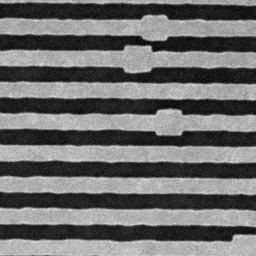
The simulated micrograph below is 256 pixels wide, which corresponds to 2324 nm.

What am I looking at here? wiring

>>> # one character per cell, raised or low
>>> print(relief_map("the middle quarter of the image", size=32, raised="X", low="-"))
XX--X------XXXXXXXXXXXXXXXXXXXXX
---------------XXXXXXX----------
--------------------------------
--------------------------------
--------------------------------
XXXXXXXXXXXXXXXXXXXXXXXXXXXXXXXX
XXXXXXXXXXXXXXXXXXXXXXXXXXXXXXXX
XXXXXXXXXXXXXXXXXXXXXXXXXXXXXXXX
XXX-----------X-XXXXXXXXXXXXXXXX
--------------------------------
--------------------------------
--------------------------X-----
-----------------------XXXXXX---
XXXXXXXXXXXXXXXXXXXXXXXXXXXXXXXX
XXXXXXXXXXXXXXXXXXXXXXXXXXXXXXXX
XXXXXXXXXXXXXXXXXXXXXXXXXXXXXXXX
-------------------XXXXXXXXXXX--
-----------------------XXXXXX---
--------------------------------
--------------------------------
--------------------------------
XXXXXXXXXXXXXXXXXXXXXXXXXXXXXXXX
XXXXXXXXXXXXXXXXXXXXXXXXXXXXXXXX
XXXXXXXXXXXXXXXXXXXXXXXXXXXXXXXX
-----------XX----------------X-X
--------------------------------
--------------------------------
--------------------------------
X-XXXXXX-X----------------------
XXXXXXXXXXXXXXXXXXXXXXXXXXXXXXXX
XXXXXXXXXXXXXXXXXXXXXXXXXXXXXXXX
XXXXXXXXXXXXXXXXXXXXXXXXXXXXXXXX